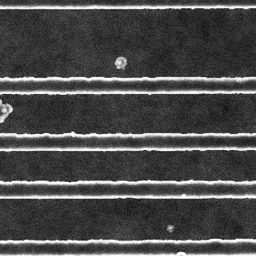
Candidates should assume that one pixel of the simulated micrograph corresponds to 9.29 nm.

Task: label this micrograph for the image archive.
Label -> lines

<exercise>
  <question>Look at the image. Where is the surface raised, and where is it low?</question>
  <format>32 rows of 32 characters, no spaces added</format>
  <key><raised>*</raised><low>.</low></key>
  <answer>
********************************
................................
................................
................................
................................
................................
................................
................................
................................
................................
********************************
********************************
................................
*...............................
*...............................
................................
................................
********************************
********************************
................................
................................
................................
................................
********************************
********************************
................................
................................
................................
................................
................................
********************************
********************************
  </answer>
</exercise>